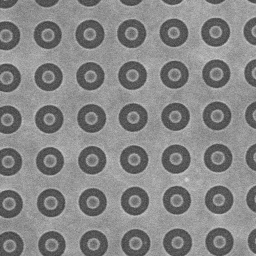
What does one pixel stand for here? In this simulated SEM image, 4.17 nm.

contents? an array of small figures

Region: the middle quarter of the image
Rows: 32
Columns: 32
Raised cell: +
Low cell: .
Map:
++++.....+++++......+++++......+
+++.......++++.......+++...++..+
+++..+++..+++...++...+++..+++..+
+++..+++..+++...++...+++..+++..+
+++...+...++++......++++.......+
++++.....++++++.....+++++.....++
+++++...++++++++..++++++++++++++
++++++++++++++++++++++++++++++++
++++++++++++++++++++++++++++++++
++++++++++++++++++++++++++++++++
+++++....++++++....+++++++....++
++++......++++.......++++......+
+++...++..++++..++...+++...++..+
+++..+++...+++..+++..+++..+++...
+++...++...+++..++...+++...+...+
++++......++++......+++++......+
+++++....++++++....+++++++...+++
++++++++++++++++++++++++++++++++
++++++++++++++++++++++++++++++++
++++++++++++++++++++++++++++++++
++++++..++++++++...+++++++....++
+++++.....+++++.....+++++......+
++++......++++.......++++..++..+
++++..++...+++..+++..+++...++...
+++...++...+++..+++..+++...++...
++++..++..++++.......++++......+
++++......+++++.....++++++.....+
++++++..+++++++++.++++++++++++++
++++++++++++++++++++++++++++++++
++++++++++++++++++++++++++++++++
+++++++++++++++++++++++++++..+++
+++++....++++++.....++++++.....+